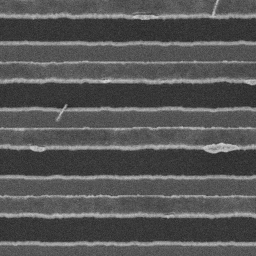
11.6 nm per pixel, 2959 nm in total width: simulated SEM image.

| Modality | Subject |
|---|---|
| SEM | lines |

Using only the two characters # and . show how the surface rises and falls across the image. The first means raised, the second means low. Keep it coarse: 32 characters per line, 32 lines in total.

################################
################################
................................
................................
................................
#####.#####..#..####..#.####.###
################################
################################
################################
################################
...............................#
................................
................................
................................
################################
################################
################################
################################
..####...#.....##........######.
................................
................................
................................
################################
################################
################################
################################
################################
................................
................................
................................
#####.....#.#...##.####....###..
################################